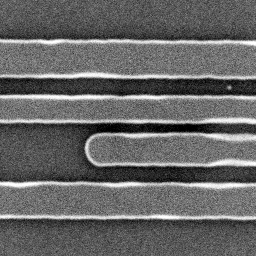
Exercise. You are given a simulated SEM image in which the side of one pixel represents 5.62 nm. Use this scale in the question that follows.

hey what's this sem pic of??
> groups of lines, slits or small figures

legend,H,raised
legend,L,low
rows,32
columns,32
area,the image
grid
LLLLLLLLLLLLLLLLLLLLLLLLLLLLLLLL
LLLLLLLLLLLLLLLLLLLLLLLLLLLLLLLL
LLLLLLLLLLLLLLLLLLLLLLLLLLLLLLLL
LLLLLLLLLLLLLLLLLLLLLLLLLLLLLLLL
LLLLLLLLLLLLLLLLLLLLLLLLLLLLLLLL
HHHHHHHHHHHHHHHHHHHHHHHHHHHHHHHH
HHHHHHHHHHHHHHHHHHHHHHHHHHHHHHHH
HHHHHHHHHHHHHHHHHHHHHHHHHHHHHHHH
HHHHHHHHHHHHHHHHHHHHHHHHHHHHHHHH
HHHHHHHHHHLLLHHHHHHHHHHHHHHHHHHH
LLLLLLLLLLLLLLLLLLLLLLLLLLLLLLLL
LLLLLLLLLLLLLLLLLLLLLLLLLLLLLLLL
HHHHHHHHHHHHHHHHHHHHHHHHHHHHHHHH
HHHHHHHHHHHHHHHHHHHHHHHHHHHHHHHH
HHHHHHHHHHHHHHHHHHHHHHHHHHHHHHHH
LLLLLLLLLLLLLLLLLLLLLLLLLLLLLLLL
LLLLLLLLLLLLLLLLLLLLLLLLLLLLLLLL
LLLLLLLLLLLHHHHHHHHHHHHHHHHHHHHH
LLLLLLLLLLLHHHHHHHHHHHHHHHHHHHHH
LLLLLLLLLLLHHHHHHHHHHHHHHHHHHHHH
LLLLLLLLLLLLHHHHHHHHHHHHHHHLLLLH
LLLLLLLLLLLLLLLLLLLLLLLLLLLLLLLL
LLLLLLLLLLLLLLLLLLLLLLLLLLLLLLLL
HHHHHHHHHHHHHHHHHHHHHHHHHHHHHHHH
HHHHHHHHHHHHHHHHHHHHHHHHHHHHHHHH
HHHHHHHHHHHHHHHHHHHHHHHHHHHHHHHH
HHHHHHHHHHHHHHHHHHHHHHHHHHHHHHHH
LLLLLLLLLLLLLLLLLLLLLLLLLLLLLLLL
LLLLLLLLLLLLLLLLLLLLLLLLLLLLLLLL
LLLLLLLLLLLLLLLLLLLLLLLLLLLLLLLL
LLLLLLLLLLLLLLLLLLLLLLLLLLLLLLLL
LLLLLLLLLLLLLLLLLLLLLLLLLLLLLLLL